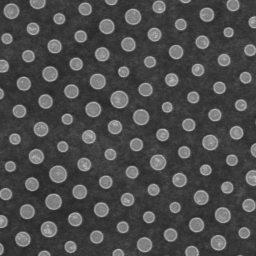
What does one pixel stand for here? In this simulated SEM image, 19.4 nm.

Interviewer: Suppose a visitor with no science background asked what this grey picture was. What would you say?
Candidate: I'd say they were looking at a regular array of raised bodies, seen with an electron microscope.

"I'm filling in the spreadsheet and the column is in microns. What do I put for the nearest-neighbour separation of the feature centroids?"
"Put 0.538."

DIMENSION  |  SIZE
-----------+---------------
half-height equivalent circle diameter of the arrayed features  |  255 nm